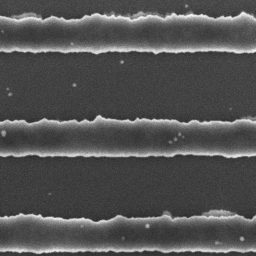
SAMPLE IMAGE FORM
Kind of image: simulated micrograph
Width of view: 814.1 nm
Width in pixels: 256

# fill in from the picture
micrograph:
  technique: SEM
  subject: lines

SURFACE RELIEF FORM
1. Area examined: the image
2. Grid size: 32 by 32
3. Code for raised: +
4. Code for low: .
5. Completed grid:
................................
................................
++++++++.+++++++++++++++++++++++
++++++++++++++++++++++++++++++++
++++++++++++++++++++++++++++++++
++++++++++++++++++++++++++++++++
...........++......+.........+..
................................
................................
................................
................................
................................
................................
................................
................................
++++++++++++++++++++++++++++++++
++++++++++++++++++++++++++++++++
++++++++++++++++++++++++++++++++
++++++++++++++++++++++++++++++++
..+..+......+..+.+..........++..
................................
................................
................................
................................
................................
................................
................................
+++++++++++..+++++++++++++++++++
++++++++++++++++++++++++++++++++
++++++++++++++++++++++++++++++++
++++++++++++++++++++++++++++++++
....++..........................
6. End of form